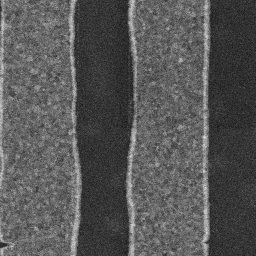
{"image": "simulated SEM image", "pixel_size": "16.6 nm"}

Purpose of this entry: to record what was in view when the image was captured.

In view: one or a few lines or trenches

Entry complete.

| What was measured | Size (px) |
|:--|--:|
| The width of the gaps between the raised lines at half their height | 59.4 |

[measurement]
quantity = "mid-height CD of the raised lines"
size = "1.2 µm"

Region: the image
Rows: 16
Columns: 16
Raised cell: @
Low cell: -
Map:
@@@@----@@@@@---
@@@@----@@@@@---
@@@@----@@@@@---
@@@@----@@@@@---
@@@@@----@@@@---
@@@@@----@@@@---
@@@@@----@@@@---
@@@@@---@@@@@---
@@@@@---@@@@@---
@@@@@---@@@@@---
@@@@@---@@@@@---
@@@@@---@@@@@---
@@@@@---@@@@@---
@@@@@---@@@@@---
@@@@@---@@@@@---
@@@@@---@@@@@---